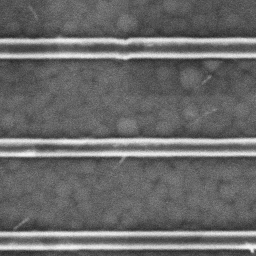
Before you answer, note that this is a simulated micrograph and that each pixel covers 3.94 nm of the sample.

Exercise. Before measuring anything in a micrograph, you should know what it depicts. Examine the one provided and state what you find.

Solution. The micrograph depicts one or a few lines or trenches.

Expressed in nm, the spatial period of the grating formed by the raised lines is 379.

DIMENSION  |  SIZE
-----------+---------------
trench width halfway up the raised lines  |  0.319 µm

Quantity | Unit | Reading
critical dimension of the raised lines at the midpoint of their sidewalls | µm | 0.0552